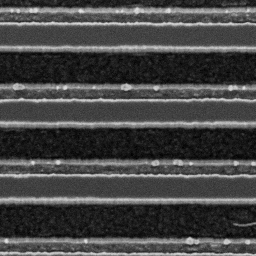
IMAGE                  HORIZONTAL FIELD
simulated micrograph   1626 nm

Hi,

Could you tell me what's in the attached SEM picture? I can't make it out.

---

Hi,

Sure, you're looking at lines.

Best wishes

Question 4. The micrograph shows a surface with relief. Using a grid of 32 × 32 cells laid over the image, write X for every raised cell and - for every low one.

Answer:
--------------------------------
XXXXXXXXXXXXXXXXXXXXXXXXXXXXXXXX
XXXXXXXXXXXXXXXXXXXXXXXXXXXXXXXX
XXXXXXXXXXXXXXXXXXXXXXXXXXXXXXXX
XXXXXXXXXXXXXXXXXXXXXXXXXXXXXXXX
XXXXXXXXXXXXXXXXXXXXXXXXXXXXXXXX
--------------------------------
--------------------------------
--------------------------------
--------------------------------
--------------------------------
XXXXXXXXXXXXXXXXXXXXXXXXXXXXXXXX
XXXXXXXXXXXXXXXXXXXXXXXXXXXXXXXX
XXXXXXXXXXXXXXXXXXXXXXXXXXXXXXXX
XXXXXXXXXXXXXXXXXXXXXXXXXXXXXXXX
X-XXXXXXXXXXX-X-XXXXXX-XXXXXXXXX
--------------------------------
--------------------------------
--------------------------------
--------------------------------
XXXXXXXXXXXXXXXXXXXXXXXXXXXXXX-X
XXXXXXXXXXXXXXXXXXXXXXXXXXXXXXXX
XXXXXXXXXXXXXXXXXXXXXXXXXXXXXXXX
XXXXXXXXXXXXXXXXXXXXXXXXXXXXXXXX
XXXXXXXXXXXXXXXXXXXXXXXXXXXXXXXX
--------------------------------
--------------------------------
--------------------------------
--------------------------------
--------------------------------
XXXXXXXXXXXXXXXXXXXXXXXXXXXXXXXX
XXXXXXXXXXXXXXXXXXXXXXXXXXXXXXXX